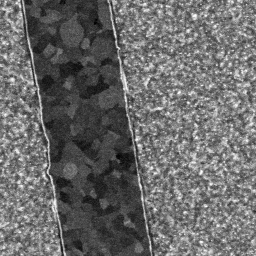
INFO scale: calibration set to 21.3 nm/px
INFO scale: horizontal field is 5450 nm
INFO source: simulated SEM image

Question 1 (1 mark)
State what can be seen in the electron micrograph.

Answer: one or a few lines or trenches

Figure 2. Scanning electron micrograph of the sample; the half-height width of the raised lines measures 1.83 um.